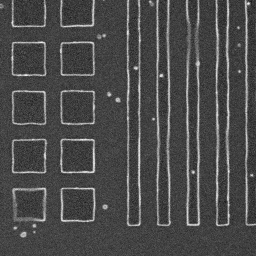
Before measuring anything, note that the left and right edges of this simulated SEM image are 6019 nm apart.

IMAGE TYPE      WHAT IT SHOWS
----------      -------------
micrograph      groups of lines, slits or small figures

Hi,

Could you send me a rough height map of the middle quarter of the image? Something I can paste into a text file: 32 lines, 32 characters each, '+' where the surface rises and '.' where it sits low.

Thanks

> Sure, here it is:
+++++++.........+++....+++.....+
+++++++.........+++....+++.....+
+++++++.........+++....+++.....+
................+++....+++.....+
................+++....+++.....+
................+++....+++.....+
................+++....+++.....+
+++++++.........+++....+++.....+
+++++++.........+++....+++.....+
+++++++.........+++....+++.....+
+++++++.........+++....+++.....+
+++++++.........+++....+++.....+
+++++++.........+++....+++.....+
+++++++.........+++....+++.....+
+++++++.........+++....+++.....+
................+++.....++.....+
................+++.....++.....+
................+++.....++.....+
................+++.....++.....+
+++++++.........+++.....++.....+
+++++++.........+++.....++.....+
+++++++.........+++.....++.....+
+++++++.........+++.....++.....+
+++++++.........+++.....++.....+
+++++++.........+++.....++.....+
+++++++.........+++.....++.....+
+++++++.........+++.....++.....+
................+++....+++.....+
................+++....+++.....+
................+++....+++.....+
................+++....+++.....+
+++++++.........+++....+++.....+